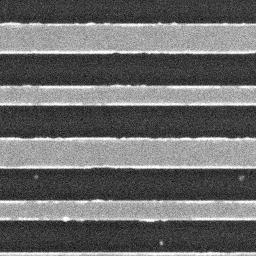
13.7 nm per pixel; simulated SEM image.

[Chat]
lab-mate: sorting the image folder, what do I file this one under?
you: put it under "lines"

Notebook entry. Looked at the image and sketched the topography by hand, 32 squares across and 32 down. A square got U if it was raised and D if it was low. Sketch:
DDDDDDDDDDDDDDDDDDDDDDDDDDDDDDDD
DDDDDDDDDDDDDDDDDDDDDDDDDDDDDDDD
DDDDDDDDDDDDDDDDDDDDDDDDDDDDDDDD
UUUUUUUUUUUUUUUUUUUUUUUUUUUUUUUU
UUUUUUUUUUUUUUUUUUUUUUUUUUUUUUUU
UUUUUUUUUUUUUUUUUUUUUUUUUUUUUUUU
UUUUUUUUUUUUUUDUUUDUUUUUUUUUUUUU
DDDDDDDDDDDDDDDDDDDDDDDDDDDDDDDD
DDDDDDDDDDDDDDDDDDDDDDDDDDDDDDDD
DDDDDDDDDDDDDDDDDDDDDDDDDDDDDDDD
DDDDDDDDDDDDDDDDDDDDDDDDDDDDDDDD
UUUUUUUUUUUUUUUUUUUUUUUUUUUUUUUU
UUUUUUUUUUUUUUUUUUUUUUUUUUUUUUUU
DDDDDDDDDDDDDDDDDDDDDDDDDDDDDDDD
DDDDDDDDDDDDDDDDDDDDDDDDDDDDDDDD
DDDDDDDDDDDDDDDDDDDDDDDDDDDDDDDD
DDDDDDDDDDDDDDDDDDDDDDDDDDDDDDDD
UUUUUUUUUUUUUUUUUUUUUUUUUUUUUUUU
UUUUUUUUUUUUUUUUUUUUUUUUUUUUUUUU
UUUUUUUUUUUUUUUUUUUUUUUUUUUUUUUU
UUUUUUUUUUUUUUUUUUUUUUUUUUUUUUUU
DDDDDDDDDDDDDDDDDDDDDDDDDDDDDDDD
DDDDDDDDDDDDDDDDDDDDDDDDDDDDDDDD
DDDDDDDDDDDDDDDDDDDDDDDDDDDDDDDD
DDDDDDDDDDDDDDDDDDDDDDDDDDDDDDDD
UUUUUUUUUUUUUUUUUUUUUUUUUUUUUUUU
UUUUUUUUUUUUUUUUUUUUUUUUUUUUUUUU
DDDDDDDUUDDDDDDDDDDDDDDDDDDDDDDD
DDDDDDDDDDDDDDDDDDDDDDDDDDDDDDDD
DDDDDDDDDDDDDDDDDDDDDDDDDDDDDDDD
DDDDDDDDDDDDDDDDDDDDDDDDDDDDDDDD
DDDDDDDDDDDDDDDDDDDDDDDDDDDDDDDD